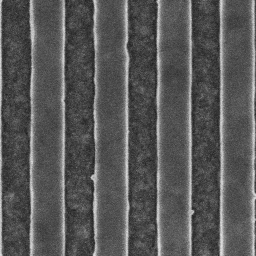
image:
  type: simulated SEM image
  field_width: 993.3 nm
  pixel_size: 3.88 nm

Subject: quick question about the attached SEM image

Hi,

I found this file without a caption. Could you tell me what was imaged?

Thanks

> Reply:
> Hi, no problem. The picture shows one or a few lines or trenches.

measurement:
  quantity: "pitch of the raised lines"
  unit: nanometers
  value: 245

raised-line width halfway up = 125 nm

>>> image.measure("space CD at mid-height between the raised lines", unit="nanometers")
118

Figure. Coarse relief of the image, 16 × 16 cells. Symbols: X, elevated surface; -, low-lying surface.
--XX--XX--XX--XX
--XX--XX--XX--XX
--XX--XX--XX--XX
--XX--XX--XX--XX
--XX--XX--XX--XX
--XX--XX--XX--XX
--XX--XX--XX--XX
--XX--XX--XX--XX
--XX--XX--XX--XX
--XX--XX--XX--XX
--XX--XX--XX--XX
--XX--XX--XX--XX
--XX--XX--XX--XX
--XX--XX--XX--XX
--XX--XX--XX--XX
--XX--XX--XX--XX